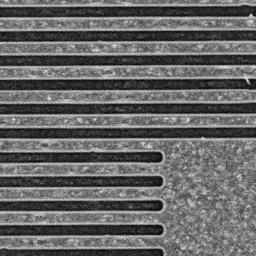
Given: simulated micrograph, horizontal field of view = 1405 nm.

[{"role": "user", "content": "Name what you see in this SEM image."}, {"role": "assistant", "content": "parallel lines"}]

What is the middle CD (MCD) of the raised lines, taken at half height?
69.3 nm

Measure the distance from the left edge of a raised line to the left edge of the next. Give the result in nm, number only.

133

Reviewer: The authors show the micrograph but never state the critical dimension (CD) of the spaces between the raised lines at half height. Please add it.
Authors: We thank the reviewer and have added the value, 63.8 nm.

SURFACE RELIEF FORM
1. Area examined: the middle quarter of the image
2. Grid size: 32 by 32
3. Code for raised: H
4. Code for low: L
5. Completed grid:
LLLLLLLLLLLLLLLLLLLLLLLLLLLLLLLL
HHHHHHHHHHHHHHHHHHHHHHHHHHHHHHHH
HHHHHHHHHHHHHHHHHHHHHHHHHHHHHHHH
HHHHHHHHHHHHHHHHHHHHHHHHHHHHHHHH
LLLLLLLLLLLLLLLLLLLLLLLLLLLLLLLL
LLLLLLLLLLLLLLLLLLLLLLLLLLLLLLLL
LLLLLLLLLLLLLLLLLLLLLLLLLLLLLLLL
HHHHHHHHHHHHHHHHHHHHHHHHHHHHHHHH
HHHHHHHHHHHHHHHHHHHHHHHHHHHHHHHH
HHHHHHHHHHHHHHHHHHHHHHHHHHHHHHHH
LLLLLLLLLLLLLLLLLLLLLLLLLLLLLLLL
LLLLLLLLLLLLLLLLLLLLLLLLLLLLLLLL
LLLLLLLLLLLLLLLLLLLLLLLLLLLLLLLL
HHHHHHHHHHHHHHHHHHHHHHHHHHHHHHHH
HHHHHHHHHHHHHHHHHHHHHHHHHHHHHHHH
HHHHHHHHHHHHHHHHHHHHHHHHHHHHHHHH
LLLLLLLLLLLLLLLLLLLLLLLLLLLLLLLL
LLLLLLLLLLLLLLLLLLLLLLLLLLLLLLLL
LLLLLLLLLLLLLLLLLLLLLLLLLLLLLLLL
HHHHHHHHHHHHHHHHHHHHHHHHHHHHHHHH
HHHHHHHHHHHHHHHHHHHHHHHHHHHHHHHH
HHHHHHHHHHHHHHHHHHHHHHHHHHHHHHHH
LLLLLLLLLLLLLLLLLLLLLLLLLHHHHHHH
LLLLLLLLLLLLLLLLLLLLLLLLLHHHHHHH
LLLLLLLLLLLLLLLLLLLLLLLLHHHHHHHH
HHHHHHHHHHHHHHHHHHHHHHHHHHHHHHHH
HHHHHHHHHHHHHHHHHHHHHHHHHHHHHHHH
HHHHHHHHHHHHHHHHHHHHHHHHHHHHHHHH
LLLLLLLLLLLLLLLLLLLLLLLLLHHHHHHH
LLLLLLLLLLLLLLLLLLLLLLLLLHHHHHHH
LLLLLLLLLLLLLLLLLLLLLLLLHHHHHHHH
HHHHHHHHHHHHHHHHHHHHHHHHHHHHHHHH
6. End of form